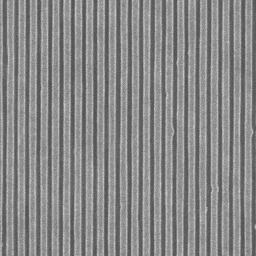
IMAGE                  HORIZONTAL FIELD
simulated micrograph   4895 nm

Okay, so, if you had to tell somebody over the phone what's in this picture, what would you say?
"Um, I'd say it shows parallel lines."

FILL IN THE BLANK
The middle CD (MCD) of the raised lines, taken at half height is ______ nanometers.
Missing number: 127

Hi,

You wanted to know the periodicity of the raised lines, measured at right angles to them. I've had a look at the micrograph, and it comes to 0.217 µm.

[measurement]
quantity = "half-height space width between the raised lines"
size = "88.5 nm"